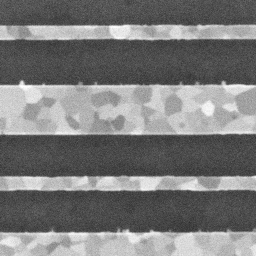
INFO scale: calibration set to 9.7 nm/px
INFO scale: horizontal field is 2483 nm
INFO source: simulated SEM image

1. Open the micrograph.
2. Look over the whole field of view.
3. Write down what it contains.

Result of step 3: lines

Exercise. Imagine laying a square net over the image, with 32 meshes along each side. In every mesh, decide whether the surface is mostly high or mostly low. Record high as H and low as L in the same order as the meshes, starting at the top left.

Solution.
LLLLLLLLLLLLLLLLLLLLLLLLLLLLLLLL
LLLLLLLLLLLLLLLLLLLLLLLLLLLLLLLL
LLLLLLLLLLLLLLLLLLLLLLLLLLLLLLLL
HHHHHHHHHHHHHHHHHHHHHHHHHHHHHHHH
HHHHHHHHHHHHHHHHHHHHHHHHHHHHHHHH
LLLLLLLLLLLLLLLLLLLLLLLLLLLLLLLL
LLLLLLLLLLLLLLLLLLLLLLLLLLLLLLLL
LLLLLLLLLLLLLLLLLLLLLLLLLLLLLLLL
LLLLLLLLLLLLLLLLLLLLLLLLLLLLLLLL
LLLLLLLLLLLLLLLLLLLLLLLLLLLLLLLL
LLLLLLLLLLLLLLLLLLLLLLLLLLLLLLLL
HHHHHHHHHHHHHHHHHHHHHHHHHHHHHHHH
HHHHHHHHHHHHHHHHHHHHHHHHHHHHHHHH
HHHHHHHHHHHHHHHHHHHHHHHHHHHHHHHH
HHHHHHHHHHHHHHHHHHHHHHHHHHHHHHHH
HHHHHHHHHHHHHHHHHHHHHHHHHHHHHHHH
HHHHHHHHHHHHHHHHHHHHHHHHHHHHHHHH
LLLLLLLLLLLLLLLLLLLLLLLLLLLLLLLL
LLLLLLLLLLLLLLLLLLLLLLLLLLLLLLLL
LLLLLLLLLLLLLLLLLLLLLLLLLLLLLLLL
LLLLLLLLLLLLLLLLLLLLLLLLLLLLLLLL
LLLLLLLLLLLLLLLLLLLLLLLLLLLLLLLL
HHHHHHHHHHHHHHHHHHHHHHHHHHHHHHHH
HHHHHHHHHHHHHHHHHHHHHHHHHHHHHHHH
LLLLLLLLLLLLLLLLLLLLLLLLLLLLLLLL
LLLLLLLLLLLLLLLLLLLLLLLLLLLLLLLL
LLLLLLLLLLLLLLLLLLLLLLLLLLLLLLLL
LLLLLLLLLLLLLLLLLLLLLLLLLLLLLLLL
LLLLLLLLLLLLLLLLLLLLLLLLLLLLLLLL
HHHHHHHHHHHHHHHHHHHHHHHHHHHHHHHH
HHHHHHHHHHHHHHHHHHHHHHHHHHHHHHHH
HHHHHHHHHHHHHHHHHHHHHHHHHHHHHHHH